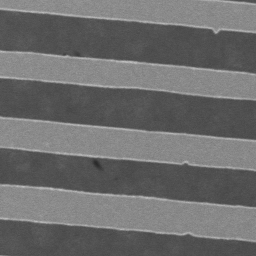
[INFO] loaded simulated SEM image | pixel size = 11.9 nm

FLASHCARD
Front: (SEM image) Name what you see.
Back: one or a few lines or trenches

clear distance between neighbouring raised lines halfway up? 0.484 micrometres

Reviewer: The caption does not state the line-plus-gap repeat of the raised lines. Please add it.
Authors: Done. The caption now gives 819 nanometers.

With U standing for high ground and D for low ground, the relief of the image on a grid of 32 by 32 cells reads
UUUUUUUUUUUUUUUUUUUUUUUUUUUUUUUD
DDDDUUUUUUUUUUUUUUUUUUUUUUUUUUUU
DDDDDDDDDDDDDDDUUUUUUUUUUUUUUUUU
DDDDDDDDDDDDDDDDDDDDDDDDDDUUUUUU
DDDDDDDDDDDDDDDDDDDDDDDDDDDDDDDD
DDDDDDDDDDDDDDDDDDDDDDDDDDDDDDDD
UUDDDDDDDDDDDDDDDDDDDDDDDDDDDDDD
UUUUUUUUUUUUUUDDDDDDDDDDDDDDDDDD
UUUUUUUUUUUUUUUUUUUUUUUUDDDDDDDD
UUUUUUUUUUUUUUUUUUUUUUUUUUUUUUUU
DDDDDDDDDDUUUUUUUUUUUUUUUUUUUUUU
DDDDDDDDDDDDDDDDDDDDDDUUUUUUUUUU
DDDDDDDDDDDDDDDDDDDDDDDDDDDDDDDD
DDDDDDDDDDDDDDDDDDDDDDDDDDDDDDDD
DDDDDDDDDDDDDDDDDDDDDDDDDDDDDDDD
UUUUUUUUDDDDDDDDDDDDDDDDDDDDDDDD
UUUUUUUUUUUUUUUUUUUDDDDDDDDDDDDD
UUUUUUUUUUUUUUUUUUUUUUUUUUUUUUDD
DUUUUUUUUUUUUUUUUUUUUUUUUUUUUUUU
DDDDDDDDDDDUUUUUUUUUUUUUUUUUUUUU
DDDDDDDDDDDDDDDDDDDDDDDDUUUUUUUU
DDDDDDDDDDDDDDDDDDDDDDDDDDDDDDDD
DDDDDDDDDDDDDDDDDDDDDDDDDDDDDDDD
UUUUUUDDDDDDDDDDDDDDDDDDDDDDDDDD
UUUUUUUUUUUUUUUUDDDDDDDDDDDDDDDD
UUUUUUUUUUUUUUUUUUUUUUUUUUDDDDDD
UUUUUUUUUUUUUUUUUUUUUUUUUUUUUUUU
DDUUUUUUUUUUUUUUUUUUUUUUUUUUUUUU
DDDDDDDDDDDDDDUUUUUUUUUUUUUUUUUU
DDDDDDDDDDDDDDDDDDDDDDDDDUUUUUUU
DDDDDDDDDDDDDDDDDDDDDDDDDDDDDDDD
DDDDDDDDDDDDDDDDDDDDDDDDDDDDDDDD